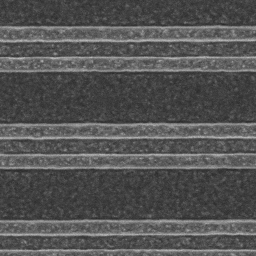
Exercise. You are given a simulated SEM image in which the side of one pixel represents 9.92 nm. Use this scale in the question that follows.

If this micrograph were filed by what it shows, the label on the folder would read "lines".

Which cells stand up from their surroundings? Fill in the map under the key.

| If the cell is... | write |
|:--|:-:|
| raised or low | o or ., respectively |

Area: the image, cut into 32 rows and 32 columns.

................................
................................
................................
.........................ooo....
oooooooooooooooooooooooooooooooo
oooooooooooooooooooooooooooooooo
oooooooooooooooooooooooooooooooo
oooooooooooooooooooooooooooooooo
oooooooooooooooooooooooooooooooo
................................
................................
................................
................................
................................
................................
................................
oooooooooooooooooooooooooooooooo
oooooooooooooooooooooooooooooooo
oooooooooooooooooooooooooooooooo
oooooooooooooooooooooooooooooooo
oooooooooooooooooooooooooooooooo
................................
................................
................................
................................
................................
................................
................................
oooooooooooooooooooooooooooooooo
oooooooooooooooooooooooooooooooo
oooooooooooooooooooooooooooooooo
oooooooooooooooooooooooooooooooo